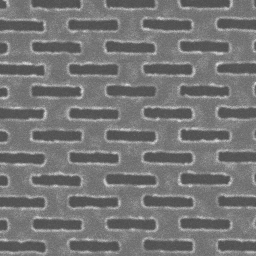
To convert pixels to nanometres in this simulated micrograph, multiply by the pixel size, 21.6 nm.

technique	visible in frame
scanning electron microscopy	a regular array of holes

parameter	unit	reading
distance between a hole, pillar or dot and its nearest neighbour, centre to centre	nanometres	919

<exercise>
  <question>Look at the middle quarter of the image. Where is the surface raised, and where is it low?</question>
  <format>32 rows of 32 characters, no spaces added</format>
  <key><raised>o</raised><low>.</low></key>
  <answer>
o.............oooooo............
o.............oooooo............
oo............oooooo............
oooooooooooooooooooooooooooooooo
oooooooooooooooooooooooooooooooo
.oooooooooo.....ooo..oooooooo...
....ooooooo............oooooo...
....ooooooo............oooooo...
oooooooooooooooooooooooooooooooo
oooooooooooooooooooooooooooooooo
oooooooooooooooooooooooooooooooo
o.............oooooo............
o.............oooooo............
oo............ooooooo...........
oooooooooooooooooooooooooooooooo
oooooooooooooooooooooooooooooooo
ooooooooooo.ooooooo.ooooooooo...
.....ooooo.............oooooo...
....ooooooo............oooooo...
oooooooooooooooo...o..oooooooooo
oooooooooooooooooooooooooooooooo
oooooooooooooooooooooooooooooooo
o............ooooooo............
o.............oooooo............
oo............ooooooo...........
oooooooooooooooooooooooooooooooo
oooooooooooooooooooooooooooooooo
ooooooooooo......oooooooooooo...
....oooooo.............oooooo...
....oooooo.............oooooo...
....oooooooooooooooooooooooooooo
oooooooooooooooooooooooooooooooo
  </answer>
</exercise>